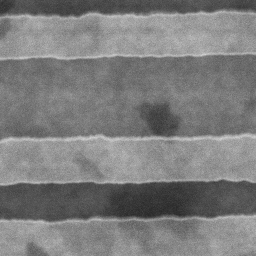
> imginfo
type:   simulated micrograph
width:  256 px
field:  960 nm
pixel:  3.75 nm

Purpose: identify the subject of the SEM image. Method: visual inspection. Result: lines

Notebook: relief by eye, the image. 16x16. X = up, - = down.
----------------
XXXXXXXXXXXXXXXX
XXXXXXXXXXXXXXXX
XXXXXXXXXXXXX---
----------------
----------------
----------------
----------------
---------------X
XXXXXXXXXXXXXXXX
XXXXXXXXXXXXXXXX
X---------------
----------------
--------------XX
XXXXXXXXXXXXXXXX
XXXXXXXXXXXXXXXX